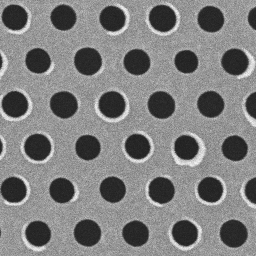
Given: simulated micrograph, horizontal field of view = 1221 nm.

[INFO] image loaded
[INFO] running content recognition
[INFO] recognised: a regular array of holes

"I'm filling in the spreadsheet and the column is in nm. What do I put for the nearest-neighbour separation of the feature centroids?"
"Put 232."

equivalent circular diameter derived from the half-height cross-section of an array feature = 124 nanometers